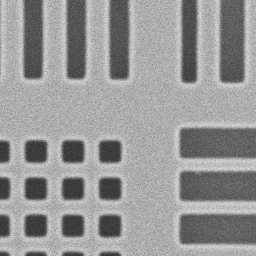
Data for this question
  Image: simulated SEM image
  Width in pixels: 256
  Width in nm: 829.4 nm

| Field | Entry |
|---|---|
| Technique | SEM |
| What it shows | groups of lines, slits or small figures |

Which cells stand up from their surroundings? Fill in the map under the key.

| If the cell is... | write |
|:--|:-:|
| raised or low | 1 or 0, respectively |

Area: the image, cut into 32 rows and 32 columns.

11100111000111001111111001100001
11100111000111001111111001100001
11100111000111001111111001100001
11100111000111001111111001100001
11100111000111001111111001100001
11100111000111001111111001100001
11100111000111001111111001100001
11100111000111001111111001100001
11100111000111001111111001100001
11100111000111001111111001100001
11111111111111111111111111111111
11111111111111111111111111111111
11111111111111111111111111111111
11111111111111111111111111111111
11111111111111111111111111111111
11111111111111111111111111111111
11111111111111111111110000000000
11110111111111111111110000000000
01100011000100011111110000000000
01100011000100011111111000000000
11111111111111111111111111111111
11111111111111111111111000000000
01100011001100011111110000000000
01100011000100011111110000000000
01100011001100011111110000000000
11111111111111111111111111111111
11111111111111111111111111111111
01100011001100011111110000000000
01100011000100011111110000000000
01100011001110011111110000000000
11111111111111111111111000000000
01110111001110011111111111111111